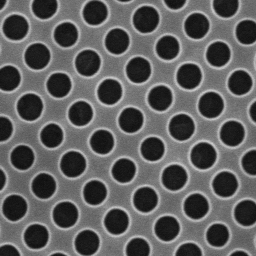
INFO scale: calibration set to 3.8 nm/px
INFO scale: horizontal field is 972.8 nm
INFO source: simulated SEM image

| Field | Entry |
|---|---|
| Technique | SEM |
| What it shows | a regular array of holes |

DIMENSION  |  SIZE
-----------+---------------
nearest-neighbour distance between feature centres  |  0.136 micrometres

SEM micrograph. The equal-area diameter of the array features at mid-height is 0.101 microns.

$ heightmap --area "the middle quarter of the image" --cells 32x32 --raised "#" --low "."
###......######.......#######...
###......######.......######....
.###....#######.......######....
.###############.....#######....
..#######.....###...########....
..######......#########...###...
..######.......#######.....####.
.#######.......######......#####
########......#######......#####
###...###....########......#####
##.....##############......#####
#......########....###....######
#......#######......########..##
#......#######......#######.....
##....#######.......######......
###..#########......######......
########..####.....#######......
#######.....##############......
######......#########...###....#
######.......######......#######
######......#######......#######
#######.....#######......#######
.....###...########......######.
.....#########..####....#######.
......#######....###############
......######......########...###
.....#######......#######.....##
....########......######.......#
##.#########.....#######.......#
######....###...########.......#
#####.....###############.....##
#####......#######.....###...###